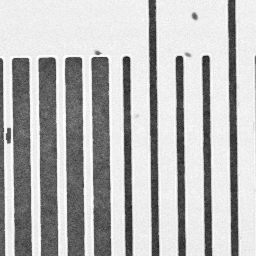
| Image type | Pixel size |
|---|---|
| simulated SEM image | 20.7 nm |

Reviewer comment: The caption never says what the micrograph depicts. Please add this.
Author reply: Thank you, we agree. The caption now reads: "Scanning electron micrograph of groups of lines, slits or small figures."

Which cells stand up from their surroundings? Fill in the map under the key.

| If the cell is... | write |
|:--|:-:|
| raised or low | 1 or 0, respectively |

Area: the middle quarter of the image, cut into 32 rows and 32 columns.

00000100000011100111100111110011
00000110000011100111100111110011
00000110000011100111100011110011
00000110000011100111100011110011
00000110000011100111100011110011
00000110000011100111100011110011
00000110000011100111100011110011
00000110000011100111100011110011
00000110000011100111100011110011
00000110000011100111100011110011
00000110000011100111100011110011
00000110000011100111100011110011
00000110000011100111100011110011
00000110000011100111100011110011
00000110000011100111100011110011
00000110000011100111100011110011
00000110000011100111100011110011
00000110000011100111100011110011
00000110000011100111100011110011
00000110000011100111100011110011
00000110000011100111100011110011
00000110000011100111100011110011
00000110000011100111100011110011
00000110000011100111100011110001
00000110000011100111100011110001
00000110000011100111100011110001
00000110000011100111100011110001
00000110000011100111100011110001
00000110000011100111100011110001
00000110000011100111100011110001
00000110000011100111100011110001
00000110000011100111100011110001